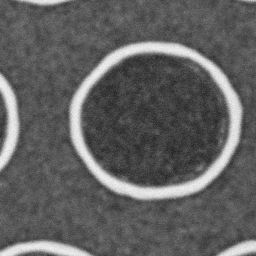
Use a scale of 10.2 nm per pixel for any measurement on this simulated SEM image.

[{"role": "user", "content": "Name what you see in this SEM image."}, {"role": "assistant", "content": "raised bodies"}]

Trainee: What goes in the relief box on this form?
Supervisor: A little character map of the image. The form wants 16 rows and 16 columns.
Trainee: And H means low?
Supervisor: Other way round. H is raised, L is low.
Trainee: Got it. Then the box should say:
LLLLLLLLLLLLLLLL
LLLLLLLLLLLLLLLL
LLLLLLLLLLLLLLLL
LLLLLLLHHHHHLLLL
LLLLLLHHHHHHHLLL
LLLLLHHHHHHHHHLL
HLLLLHHHHHHHHHHL
HLLLLHHHHHHHHHHL
HLLLLHHHHHHHHHHL
LLLLLHHHHHHHHHLL
LLLLLLHHHHHHHHLL
LLLLLLLHHHHHHLLL
LLLLLLLLLLLLLLLL
LLLLLLLLLLLLLLLL
LLLLLLLLLLLLLLLL
LHHLLLLLLLLLLLLH